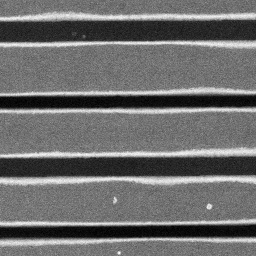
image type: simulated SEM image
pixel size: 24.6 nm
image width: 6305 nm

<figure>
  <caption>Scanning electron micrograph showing lines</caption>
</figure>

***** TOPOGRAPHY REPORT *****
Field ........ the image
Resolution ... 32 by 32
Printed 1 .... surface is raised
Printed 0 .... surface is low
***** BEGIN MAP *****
11111111111111111111111111111111
11111111111111111111111111111111
11111100000000000000000000000000
00000000000000000000000000000000
00000000000000000000000000000000
11111111111111111111111111111111
11111111111111111111111111111111
11111111111111111111111111111111
11111111111111111111111111111111
11111111111111111111111111111111
11111111111111111111111111111111
11111111111111111111111111111111
00000000000000000000000000000000
00000000000000000000000000111111
11111111111111111111111111111111
11111111111111111111111111111111
11111111111111111111111111111111
11111111111111111111111111111111
11111111111111111111111111111111
11111111111110000000000000000000
00000000000000000000000000000000
00000000000000000000000000000000
11111111111111111111111111111111
11111111111111111111111111111111
11111111111111111111111111111111
11111111111111111111111111111111
11111111111111111111111111111111
11111111111111111111111111111111
00000000000000000000000000000000
00000000000000000000000000000000
11111111111111111111111111111111
11111111111111111111111111111111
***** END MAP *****